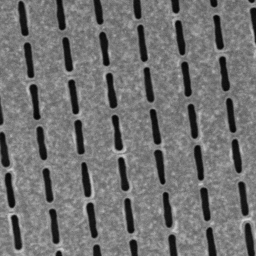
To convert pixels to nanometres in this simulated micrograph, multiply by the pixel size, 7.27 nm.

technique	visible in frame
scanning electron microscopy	a regular array of holes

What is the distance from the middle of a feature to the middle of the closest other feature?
277 nanometers